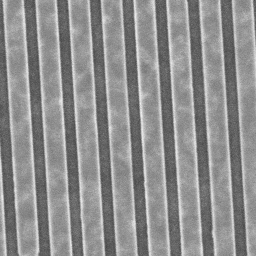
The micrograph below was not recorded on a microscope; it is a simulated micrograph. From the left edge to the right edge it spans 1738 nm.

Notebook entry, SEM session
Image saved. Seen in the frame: parallel lines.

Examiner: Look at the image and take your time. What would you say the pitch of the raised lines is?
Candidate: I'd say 222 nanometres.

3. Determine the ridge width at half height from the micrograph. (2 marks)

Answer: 137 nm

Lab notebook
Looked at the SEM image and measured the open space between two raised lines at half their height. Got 85.5 nanometres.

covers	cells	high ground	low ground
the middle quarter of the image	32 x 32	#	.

..#####...#####....####....#####
..#####...#####....####....#####
..#####...#####....#####...#####
...####....####....#####...#####
...####....####....#####...#####
...####....#####...#####...#####
...#####...#####...#####...#####
...#####...#####...#####...#####
...#####...#####...#####...#####
...#####...#####...#####...#####
...#####...#####...#####...#####
...#####...#####...#####...#####
...#####...#####...#####....####
...#####...#####...#####....####
...#####...#####...#####....####
...#####...#####...#####....####
...#####...#####....####....####
...#####...#####....####....####
...#####...######...#####...####
...#####...######...#####...####
....####....#####...#####...####
....####....#####...#####...####
....#####...#####...#####...####
....#####...#####...#####...####
....#####...#####...#####...####
....#####...#####...#####...####
#...#####...#####...#####...####
#...#####...#####...#####...####
#...#####...#####...#####...####
#...#####...#####...#####....###
#...#####...#####...#####....###
#...#####...#####...#####....###